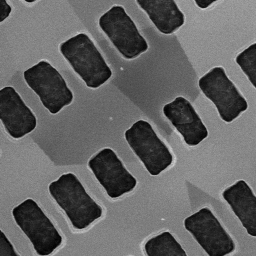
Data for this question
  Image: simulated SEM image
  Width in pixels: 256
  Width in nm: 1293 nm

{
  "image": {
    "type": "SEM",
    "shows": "a regular array of holes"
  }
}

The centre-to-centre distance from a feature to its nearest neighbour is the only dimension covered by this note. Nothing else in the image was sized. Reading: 230 nm